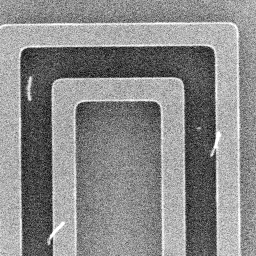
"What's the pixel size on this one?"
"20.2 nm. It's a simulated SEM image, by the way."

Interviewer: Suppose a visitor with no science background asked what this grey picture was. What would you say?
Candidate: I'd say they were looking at groups of lines, slits or small figures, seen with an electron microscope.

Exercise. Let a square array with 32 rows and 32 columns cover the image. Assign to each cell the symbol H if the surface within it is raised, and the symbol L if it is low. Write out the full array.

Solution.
LLLLLLLLLLLLLLLLLLLLLLLLLLLLLLLL
LLLLLLLLLLLLLLLLLLLLLLLLLLLLLLLL
LLLLLLLLLLLLLLLLLLLLLLLLLLLLLLLL
HHHHHHHHHHHHHHHHHHHHHHHHHHHHHHLL
HHHHHHHHHHHHHHHHHHHHHHHHHHHHHHLL
HHHHHHHHHHHHHHHHHHHHHHHHHHHHHHLL
HHHLLLLLLLLLLLLLLLLLLLLLLLLHHHLL
HHLLLLLLLLLLLLLLLLLLLLLLLLLHHHLL
HHLLLLLLLLLLLLLLLLLLLLLLLLLHHHLL
HHLLLLLLLLLLLLLLLLLLLLLLLLLHHHLL
HHLLLLLHHHHHHHHHHHHHHHHLLLLHHHLL
HHLLLLLHHHHHHHHHHHHHHHHLLLLHHHLL
HHHLLLLHHHHHHHHHHHHHHHHLLLLHHHLL
HHHLLLLHHLLLLLLLLLLLHHHLLLLHHHLL
HHHLLLLHHLLLLLLLLLLLHHHLLLLHHHLL
HHHLLLLHHLLLLLLLLLLLHHHLLLLHHHLL
HHHLLLLHHLLLLLLLLLLLHHHLLLLHHHLL
HHHLLLLHHLLLLLLLLLLLHHHLLLLHHHLL
HHHLLLLHHLLLLLLLLLLLHHHLLLLHHHLL
HHHLLLLHHLLLLLLLLLLLHHHLLLLHHHLL
HHHLLLLHHLLLLLLLLLLLHHHLLLLHHHLL
HHHLLLLHHLLLLLLLLLLLHHHLLLLHHHLL
HHHLLLLHHLLLLLLLLLLLHHHLLLLHHHLL
HHHLLLLHHLLLLLLLLLLLHHHLLLLHHHLL
HHHLLLLHHLLLLLLLLLLLHHHLLLLHHHLL
HHHLLLLHHLLLLLLLLLLLHHHLLLLHHHLL
HHHLLLLHHLLLLLLLLLLLHHHLLLLHHHLL
HHHLLLLHHLLLLLLLLLLLHHHLLLLHHHLL
HHHLLLLHHLLLLLLLLLLLHHHLLLLHHHLL
HHHLLLLHHLLLLLLLLLLLHHHLLLLHHHLL
HHHLLLLHHLLLLLLLLLLLHHHLLLLHHHLL
HHHLLLLHHLLLLLLLLLLLHHHLLLLHHHLL